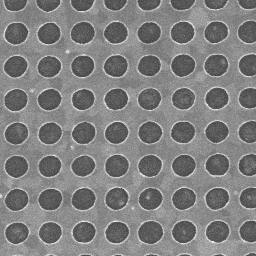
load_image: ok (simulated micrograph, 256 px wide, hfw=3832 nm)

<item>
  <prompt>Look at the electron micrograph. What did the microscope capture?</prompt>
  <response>a regular array of holes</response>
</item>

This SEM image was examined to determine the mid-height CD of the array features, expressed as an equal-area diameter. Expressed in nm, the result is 343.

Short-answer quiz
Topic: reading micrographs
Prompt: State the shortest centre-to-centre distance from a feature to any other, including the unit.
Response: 0.494 microns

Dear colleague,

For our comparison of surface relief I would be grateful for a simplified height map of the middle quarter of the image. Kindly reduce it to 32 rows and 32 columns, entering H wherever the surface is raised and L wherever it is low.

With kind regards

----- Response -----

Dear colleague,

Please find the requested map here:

HHLLLLLLHHLLLLLLHHLLLLLLHHHLLLLL
HHLLLLLHHHLLLLLLHHHLLLLLHHHLLLLL
HHLLLLLHHHHLLLLHHHHLLLLHHHHHLLLL
HHHHHHHHHHHHHHHHHHHHHHHHHHHHHHHH
HHHHHHHHHHHHHHHHHHHHHHHHHHHHHHHH
HHHHHHHHHHHHHHHHHHHHHHHHHHHHHHHH
HHHHLLHHHHHLLLLHHHHHLLLHHHHHLLLL
HHLLLLLHHHHLLLLLHHHLLLLLHHHLLLLL
HHLLLLLLHHLLLLLLHHLLLLLLHHHLLLLL
HHLLLLLHHHLLLLLLHHLLLLLLHHHLLLLL
HHLLLLLHHHHLLLLHHHHLLLLLHHHHLLLL
HHHHLHHHHHHHLLHHHHHHLLHHHHHHHLHH
HHHHHHHHHHHHHHHHHHHHHHHHHHHHHHHH
HHHHHHHHHHHHHHHHHHHHHHHHHHHHHHHH
HHHHHHHHHHHHHLHHHHHHLLHHHHHHHLLH
HHHLLLLHHHHLLLLLHHHLLLLLHHHLLLLL
HHLLLLLLHHLLLLLLHHHLLLLLHHHLLLLL
HHLLLLLLHHLLLLLLHHLLLLLLHHHLLLLL
HHLLLLLHHHLLLLLLHHHLLLLLHHHLLLLL
HHHLLLHHHHHHLLLHHHHHLLLHHHHHLLLH
HHHHHHHHHHHHHHHHHHHHHHHHHHHHHHHH
HHHHHHHHHHHHHHHHHHHHHHHHHHHHHHHH
HHHHHHHHHHHHHHHHHHHHHHHHHHHHHHHH
HHHLLLLHHHHLLLLLHHHHLLLLHHHHLLLL
HHLLLLLLHHLLLLLLHHHLLLLLHHHLLLLL
HHLLLLLLHHLLLLLLHHLLLLLLLHHLLLLL
HHLLLLLLHHLLLLLLHHHLLLLLHHHLLLLL
HHHLLLLHHHHLLLLHHHHLLLLHHHHHLLLL
HHHHHHHHHHHHHHHHHHHHHHHHHHHHHHHH
HHHHHHHHHHHHHHHHHHHHHHHHHHHHHHHH
HHHHHHHHHHHHHHHHHHHHHHHHHHHHHHHH
HHHLLLLHHHHLLLLHHHHHLLLLHHHHLLLL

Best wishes